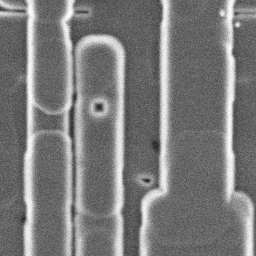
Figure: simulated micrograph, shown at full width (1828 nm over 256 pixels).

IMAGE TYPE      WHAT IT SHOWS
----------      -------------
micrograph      wiring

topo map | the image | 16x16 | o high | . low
..oo......oooo..
..oo......oooo..
..oo.oo...oooo..
..oooooo..oooo..
..oooooo..ooooo.
..oooooo..ooooo.
..oooooo..oooo..
..oo.ooo..oooo..
..oooooo..oooo..
..oooooo..oooo..
..oooooo..oooo..
..oooooo..oooo..
..oooooo.oooooo.
..ooooo..ooooooo
..ooooo..ooooooo
..ooooo..ooooooo